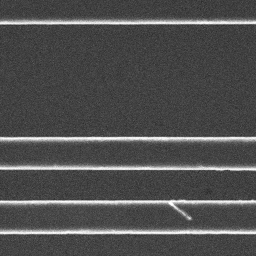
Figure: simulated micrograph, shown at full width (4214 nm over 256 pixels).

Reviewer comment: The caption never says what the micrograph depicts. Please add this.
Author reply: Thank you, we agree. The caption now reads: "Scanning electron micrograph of lines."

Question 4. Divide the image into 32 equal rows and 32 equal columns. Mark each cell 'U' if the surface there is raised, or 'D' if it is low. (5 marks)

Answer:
UUUUUUUUUUUUUUUUUUUUUUUUUUUUUUUU
UUUUUUUUUUUUUUUUUUUUUUUUUUUUUUUU
UUUUUUUUUUUUUUUUUUUUUUUUUUUUUUUU
DDDDDDDDDDDDDDDDDDDDDDDDDDDDDDDD
DDDDDDDDDDDDDDDDDDDDDDDDDDDDDDDD
DDDDDDDDDDDDDDDDDDDDDDDDDDDDDDDD
DDDDDDDDDDDDDDDDDDDDDDDDDDDDDDDD
DDDDDDDDDDDDDDDDDDDDDDDDDDDDDDDD
DDDDDDDDDDDDDDDDDDDDDDDDDDDDDDDD
DDDDDDDDDDDDDDDDDDDDDDDDDDDDDDDD
DDDDDDDDDDDDDDDDDDDDDDDDDDDDDDDD
DDDDDDDDDDDDDDDDDDDDDDDDDDDDDDDD
DDDDDDDDDDDDDDDDDDDDDDDDDDDDDDDD
DDDDDDDDDDDDDDDDDDDDDDDDDDDDDDDD
DDDDDDDDDDDDDDDDDDDDDDDDDDDDDDDD
DDDDDDDDDDDDDDDDDDDDDDDDDDDDDDDD
DDDDDDDDDDDDDDDDDDDDDDDDDDDDDDDD
UUUUUUUUUUUUUUUUUUUUUUUUUUUUUUUU
UUUUUUUUUUUUUUUUUUUUUUUUUUUUUUUU
UUUUUUUUUUUUUUUUUUUUUUUUUUUUUUUU
UUUUUUUUUUUUUUUUUUUUUUUUUUUUUUUU
DDDDDDDDDDDDDDDDDDDDDDDDDDDDDDDD
DDDDDDDDDDDDDDDDDDDDDDDDDDDDDDDD
DDDDDDDDDDDDDDDDDDDDDDDDDDDDDDDD
DDDDDDDDDDDDDDDDDDDDDDDDDDDDDDDD
UUUUUUUUUUUUUUUUUUUUUUUUUUUUUUUU
UUUUUUUUUUUUUUUUUUUUUUUUUUUUUUUU
UUUUUUUUUUUUUUUUUUUUUUUUUUUUUUUU
UUUUUUUUUUUUUUUUUUUUUUUUUUUUUUUU
DDDDDDDDDDDDDDDDDDDDDDDDDDDDDDDD
DDDDDDDDDDDDDDDDDDDDDDDDDDDDDDDD
DDDDDDDDDDDDDDDDDDDDDDDDDDDDDDDD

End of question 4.